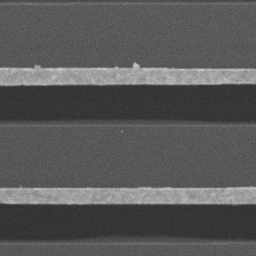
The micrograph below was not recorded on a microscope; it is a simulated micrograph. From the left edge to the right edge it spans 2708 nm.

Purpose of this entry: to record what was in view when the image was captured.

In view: lines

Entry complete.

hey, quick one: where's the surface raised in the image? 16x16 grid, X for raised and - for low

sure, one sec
XXXXXXXXXXXXXXXX
XXXXXXXXXXXXXXXX
XXXXXXXXXXXXXXXX
XXXXXXXXXXXXXXXX
XXXXXXXXXXXXXXXX
----------------
----------------
----------------
XXXXXXXXXXXXXXXX
XXXXXXXXXXXXXXXX
XXXXXXXXXXXXXXXX
XXXXXXXXXXXXXXXX
XXXXXXXXXXXXXXXX
----------------
----------------
XXXXXXXXXXXXXXXX